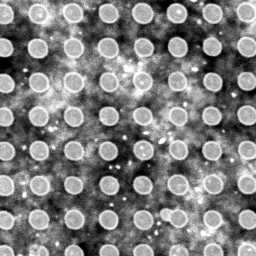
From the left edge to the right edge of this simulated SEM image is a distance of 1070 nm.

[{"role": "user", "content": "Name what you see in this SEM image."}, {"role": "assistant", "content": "a regular array of raised bodies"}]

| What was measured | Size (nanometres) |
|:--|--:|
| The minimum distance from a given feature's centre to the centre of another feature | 142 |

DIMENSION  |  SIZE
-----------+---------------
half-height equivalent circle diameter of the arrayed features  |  78.6 nm